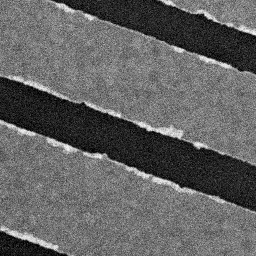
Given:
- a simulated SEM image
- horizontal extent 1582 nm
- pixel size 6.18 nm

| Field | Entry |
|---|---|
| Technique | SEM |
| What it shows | one or a few lines or trenches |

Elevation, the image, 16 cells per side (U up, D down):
UUUUDDDDDDDUUUUU
UUUUUUUDDDDDDDUU
UUUUUUUUUUDDDDDD
UUUUUUUUUUUUUDDD
UUUUUUUUUUUUUUUD
DDUUUUUUUUUUUUUU
DDDDDUUUUUUUUUUU
DDDDDDDDUUUUUUUU
UUUDDDDDDDDUUUUU
UUUUUDDDDDDDDDUU
UUUUUUUUDDDDDDDD
UUUUUUUUUUUDDDDD
UUUUUUUUUUUUUUDD
UUUUUUUUUUUUUUUU
UUUUUUUUUUUUUUUU
DDDUUUUUUUUUUUUU